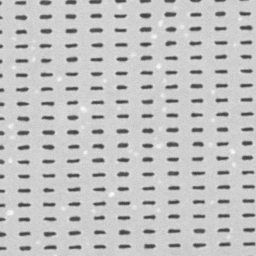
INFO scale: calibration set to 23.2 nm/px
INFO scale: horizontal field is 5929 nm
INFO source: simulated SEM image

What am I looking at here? a regular array of holes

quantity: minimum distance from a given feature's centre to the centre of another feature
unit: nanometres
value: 327